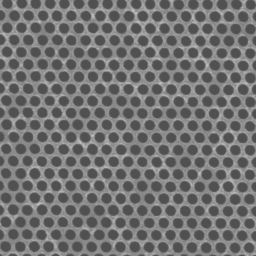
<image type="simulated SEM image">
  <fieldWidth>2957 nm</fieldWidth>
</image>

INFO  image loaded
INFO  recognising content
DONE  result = a regular array of holes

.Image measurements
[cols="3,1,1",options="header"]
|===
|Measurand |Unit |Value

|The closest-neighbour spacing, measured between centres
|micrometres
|0.159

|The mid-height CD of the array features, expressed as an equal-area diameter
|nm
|125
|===